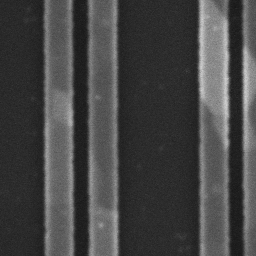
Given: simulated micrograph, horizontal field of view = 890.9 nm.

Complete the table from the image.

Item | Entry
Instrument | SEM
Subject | lines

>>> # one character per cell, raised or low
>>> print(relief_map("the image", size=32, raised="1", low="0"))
00000011100111100000000001110011
00000011100111100000000001110011
00000011100111100000000001110011
00000011100111100000000001110011
00000011100111100000000001110011
00000011100111100000000001110001
00000011100111100000000001110001
00000011100111100000000001111001
00000011100111100000000001110011
00000011100111100000000001110001
00000011100111100000000001110001
00000011100111100000000001110001
00000011100111100000000001110001
00000011100111100000000001110001
00000011100111100000000001111001
00000011100111100000000001110001
00000011100111100000000001110001
00000011100111100000000001111001
00000011100111100000000001110001
00000011100111100000000001110001
00000011100111100000000001110001
00000011100111100000000001111001
00000011100111100000000001111001
00000011100111100000000001110011
00000011100111100000000001111001
00000011100111100000000001111001
00000011100111100000000001111001
00000011100111100000000001111001
00000011100111100000000001111001
00000011100111100000000001111001
00000011100111100000000001111001
00000011100111100000000001111001